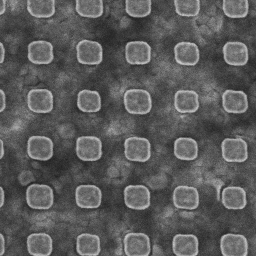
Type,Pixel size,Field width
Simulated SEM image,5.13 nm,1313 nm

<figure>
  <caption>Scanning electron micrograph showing a regular array of raised bodies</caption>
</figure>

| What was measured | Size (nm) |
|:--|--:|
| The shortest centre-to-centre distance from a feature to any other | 246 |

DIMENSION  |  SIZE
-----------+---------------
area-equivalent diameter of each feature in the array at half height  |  124 nm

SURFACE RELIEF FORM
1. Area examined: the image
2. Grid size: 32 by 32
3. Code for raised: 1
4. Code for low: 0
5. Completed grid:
10001110001110001110001110001110
00001110001110001110001110001110
00000000000000000000000000000000
00000000000000000000000000000000
00000000000000000000000000000000
00001100001100001100001100001100
00001100001110001110001110001110
00001100001110001110001110001110
00000000000000000000000000000000
00000000000000000000000000000000
00000000000000000000000000000000
00001100001100001100000000001100
00001100001110001110001110001110
00001100001100001110001110001110
00000000000000000000000000000000
00000000000000000000000000000000
00000000000000000000000000000000
00001100001100001100001100001100
00001100001110001110001110001110
00001100001100001110001100001110
00000000000000000000000000000000
00000000000000000000000000000000
00000000000000000000000000000000
00001100001100001100001100001100
00001100001110001110001110001110
00001100001100001110001110001110
00000000000000000000000000000000
00000000000000000000000000000000
00000000000000000000000000000000
00001100001100001100001100001100
00001100001100001110001110001110
00001100001100001110001110001110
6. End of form